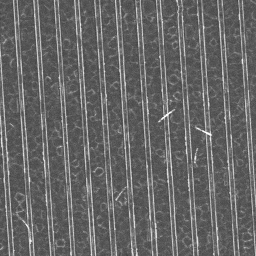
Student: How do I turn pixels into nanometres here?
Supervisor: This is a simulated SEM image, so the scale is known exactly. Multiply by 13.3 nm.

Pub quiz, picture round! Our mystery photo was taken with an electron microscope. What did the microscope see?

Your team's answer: parallel lines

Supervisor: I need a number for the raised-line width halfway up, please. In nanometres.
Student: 66.5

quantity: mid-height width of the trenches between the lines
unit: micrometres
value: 0.206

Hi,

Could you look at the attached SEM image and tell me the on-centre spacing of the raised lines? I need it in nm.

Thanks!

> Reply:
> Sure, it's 272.